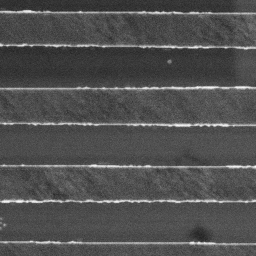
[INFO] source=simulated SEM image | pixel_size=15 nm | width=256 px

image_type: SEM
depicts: lines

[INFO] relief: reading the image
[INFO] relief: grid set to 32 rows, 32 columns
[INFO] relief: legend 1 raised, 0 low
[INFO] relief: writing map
00000000000000000000000000000000
11111000001000000000000000000000
11111111111111111111111111111111
11111111111111111111111111111111
11111111111111111111111111111111
11111111111111111111111111111111
00000000000000000000000000000000
00000000000000000000000000000000
00000000000000000000000000000000
00000000000000000000000000000000
00000000000000000000000000000000
11111111111111111111111111111111
11111111111111111111111111111111
11111111111111111111111111111111
11111111111111111111111111111111
00001111111111111111111111111111
00000000000000000000000000000000
00000000000000000000000000000000
00000000000000000000000000000000
00000000000000000000000000000000
00000000000000000000000000000000
11111111111111111111111111111111
11111111111111111111111111111111
11111111111111111111111111111111
11111111111111111111111111111111
00000000000000000000000000000000
00000000000000000000000000000000
00000000000000000000000000000000
00000000000000000000000000000000
00000000000000000000000000000000
11111111111111111111111111100000
11111111111111111111111111111111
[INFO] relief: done